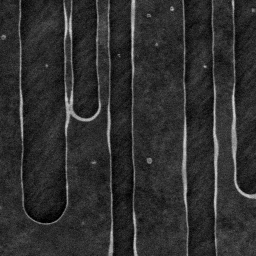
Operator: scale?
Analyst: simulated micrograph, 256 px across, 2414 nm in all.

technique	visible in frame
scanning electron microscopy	groups of lines, slits or small figures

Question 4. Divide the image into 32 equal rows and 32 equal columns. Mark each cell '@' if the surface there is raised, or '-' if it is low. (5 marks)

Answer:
@@@-----@---@@---@@@@@@----@@---
@@@-----@---@@---@@@@@@----@@---
@@@-----@---@@---@@@@@@----@@---
@@----------@@---@@@@@@----@@---
@@------@---@@---@@@@@@----@@---
@@@-----@---@@---@@@@@@----@@---
@@@-----@---@@---@@@@@@----@@---
@@@-----@---@@---@@@@@@----@@---
@@@-----@---@@---@@@@@@----@@---
@@@-----@---@@---@@@@@@----@@---
@@@-----@---@@---@@@@@@----@@---
@@@-----@---@@---@@@@@@----@@---
@@@-----@---@@---@@@@@@----@@---
@@@---------@@---@@@@@@----@@---
@@@---------@@---@@@@@@----@@---
@@@-----@@@@@@---@@@@@@----@@---
@@@-----@@@@@@---@@@@@@----@@---
@@@-----@@@@@@---@@@@@@----@@---
@@@-----@@@@@@---@@@@@@----@@---
@@@-----@@@@@@---@@@@@@----@@---
@@@-----@@@@@@---@@@@@@----@@---
@@@-----@@@@@@---@@@@@@----@@---
@@@-----@@@@@@---@@@@@@----@@---
@@@-----@@@@@@---@@@@@@----@@@--
@@@-----@@@@@@---@@@@@@----@@@@-
@@@-----@@@@@@---@@@@@@----@@@@@
@@@-----@@@@@@---@@@@@@----@@@@@
@@@@---@@@@@@@---@@@@@@----@@@@@
@@@@@@@@@@@@@@---@@@@@@----@@@@@
@@@@@@@@@@@@@@---@@@@@@----@@@@@
@@@@@@@@@@@@@@---@@@@@@----@@@@@
@@@@@@@@@@@@@@---@@@@@@----@@@@@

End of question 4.